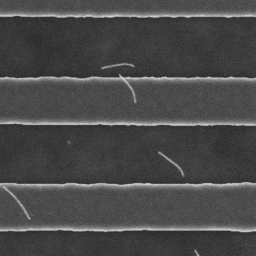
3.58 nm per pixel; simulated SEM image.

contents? lines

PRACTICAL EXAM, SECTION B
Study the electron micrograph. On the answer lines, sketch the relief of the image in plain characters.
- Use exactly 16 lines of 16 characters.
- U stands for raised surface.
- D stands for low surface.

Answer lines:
UUUUUUUUUUUUUUUU
DDDDDDDDDDDDDDDD
DDDDDDDDDDDDDDDD
DDDDDDDDDDDDDDDD
DDDDDDDDDDDDDDDD
UUUUUUUUUUUUUUUU
UUUUUUUUUUUUUUUU
UUUUUUUUUUUUUUUU
DDDDDDDDDDDDDDDD
DDDDDDDDDDDDDDDD
DDDDDDDDDDDDDDDD
UDDDUDUDUUDDDUUU
UUUUUUUUUUUUUUUU
UUUUUUUUUUUUUUUU
DDDDDDDDDDDDDDDD
DDDDDDDDDDDDDDDD